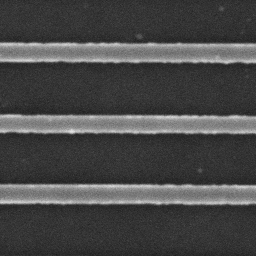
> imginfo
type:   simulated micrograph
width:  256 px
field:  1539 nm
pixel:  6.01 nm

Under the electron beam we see lines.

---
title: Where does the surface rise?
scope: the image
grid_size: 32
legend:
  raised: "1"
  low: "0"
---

00000000000000000000000000000000
00000000000000000000000000000000
00000000000000000000000000000000
00000000000000000000000000000000
00000000000000000000000000000000
11111011110011100010001000000000
11111111111111111111111111111111
11111111111111111111111111111111
00000000000000000000000000000000
00000000000000000000000000000000
00000000000000000000000000000000
00000000000000000000000000000000
00000000000000000000000000000000
00000000000000000000000000000000
11100000000000000000000000000000
11111111111111111111111111111111
10111111111111111111111111111111
00000000000000000000000000000000
00000000000000000000000000000000
00000000000000000000000000000000
00000000000000000000000000000000
00000000000000000000000000000000
00000000000000000000000000000000
11111111111111111111111111111111
11111111111111111111111111111111
00000000000000000000000000000000
00000000000000000000000000000000
00000000000000000000000000000000
00000000000000000000000000000000
00000000000000000000000000000000
00000000000000000000000000000000
00000000000000000000000000000000